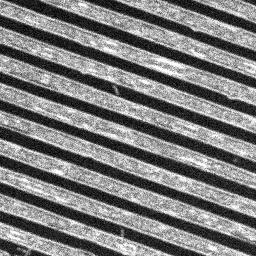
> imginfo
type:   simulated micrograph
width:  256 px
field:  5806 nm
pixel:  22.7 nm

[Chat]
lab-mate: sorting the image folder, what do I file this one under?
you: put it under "parallel lines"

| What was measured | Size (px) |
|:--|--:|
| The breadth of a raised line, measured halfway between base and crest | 13.2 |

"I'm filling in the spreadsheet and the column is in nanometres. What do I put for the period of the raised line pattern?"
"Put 596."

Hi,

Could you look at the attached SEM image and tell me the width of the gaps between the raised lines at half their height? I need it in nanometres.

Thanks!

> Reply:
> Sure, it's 297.